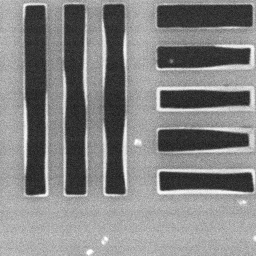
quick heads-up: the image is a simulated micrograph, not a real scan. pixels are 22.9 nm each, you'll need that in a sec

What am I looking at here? groups of lines, slits or small figures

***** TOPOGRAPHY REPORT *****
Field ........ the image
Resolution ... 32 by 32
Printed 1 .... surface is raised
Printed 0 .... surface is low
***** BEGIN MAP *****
00000000110001100000000000000010
00011100111001110000111111111111
00011100111001110000111111111111
00011100111001110000000000000000
00011100111001110000000000000000
00011100111001110000000000000000
00011100111001110000111111111110
00011100111001110000111111111110
00011100111001110000111111000000
00011100111001110000000000000000
00011100111001110000000000000000
00011100111001110000111111111110
00011100111001110000111111111110
00011100111001110000111111111000
00011100111001110000000000000000
00011100111001110000000000000000
00011100111001110000111111111110
00011100111001110000111111111110
00011100111001100000111111111110
00011100111001100000000000000000
00011100111001110000000000000000
00011100111001110000111111100110
00011100111001110000111111111111
00011100111001110000111111111111
00000000000000000000000000000000
00000000000000000000000000000000
00000000000000000000000000000000
00000000000000000000000000000000
00000000000000000000000000000000
00000000000000000000000000000000
00000000000000000000000000000000
00000000000000000000000000000000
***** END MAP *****